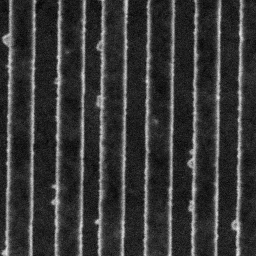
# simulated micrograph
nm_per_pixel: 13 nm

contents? lines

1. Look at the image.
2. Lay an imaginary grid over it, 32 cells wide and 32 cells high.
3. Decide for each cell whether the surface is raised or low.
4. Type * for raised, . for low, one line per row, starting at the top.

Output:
.***...****..***...***..****..**
.***...***...***...***..****..**
.***...****..***...***..***...**
.***...***...***...***..***...**
.***...***...***...***..***...**
.***...***...***...***..***...**
.***...***...***...***..***...**
.***...***...***..****..***...**
.***...***...***..****..***...**
.***...***...***..****..***...**
.***...***...***..****..***...**
.***...***...***..****..***...**
.***...***...***..****..***...**
.***...***...***..****..***...**
.***...***...***..****..***...**
.***...***...***..****..***...**
.***...***...***..****..***...**
.***...***...***..***...***...**
.***...***...***..***...***...**
.***...***...***..***...***...**
.***...***..***...***...***...**
.***...***...**...***...***...**
.***...***...**...***...***...**
.***...***...**...***...***...**
.***...***...**...***...***...**
.***...***..***...***...***...**
.***...***..***...***...***...**
.***...***..***...***...***...**
.***...***..***...***...***...**
.***...***..***...***...***...**
.***...***..***...***...***...**
.***...***..***...***...***...**